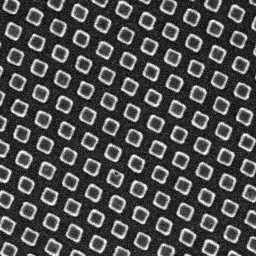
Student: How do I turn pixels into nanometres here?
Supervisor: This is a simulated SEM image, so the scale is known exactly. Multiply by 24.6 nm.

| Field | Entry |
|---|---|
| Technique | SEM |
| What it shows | a regular array of raised bodies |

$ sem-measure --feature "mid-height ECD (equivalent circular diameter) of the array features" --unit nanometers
374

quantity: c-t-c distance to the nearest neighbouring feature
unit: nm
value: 628